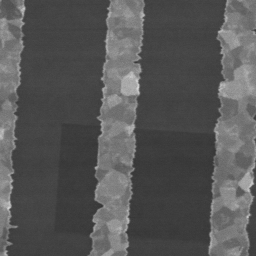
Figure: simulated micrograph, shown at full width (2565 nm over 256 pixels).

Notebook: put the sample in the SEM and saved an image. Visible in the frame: one or a few lines or trenches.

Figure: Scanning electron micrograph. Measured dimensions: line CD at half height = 340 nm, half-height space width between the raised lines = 836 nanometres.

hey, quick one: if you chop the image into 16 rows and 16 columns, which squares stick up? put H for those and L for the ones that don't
HLLLLLLHHLLLLLHH
HLLLLLLHHLLLLLHH
HLLLLLLHHLLLLLHH
HLLLLLLHHLLLLLHH
HLLLLLHHHLLLLLHH
HLLLLLHHHLLLLLHH
HLLLLLHHHLLLLLHH
HLLLLLHHLLLLLLHH
HLLLLLHHLLLLLHHH
HLLLLLHHLLLLLHHH
HLLLLLHHLLLLLHHH
HLLLLLHHLLLLLHHH
HLLLLLHHLLLLLHHH
HLLLLLHHLLLLLHHH
HLLLLLHHLLLLLHHL
LLLLLLHHLLLLLHHH